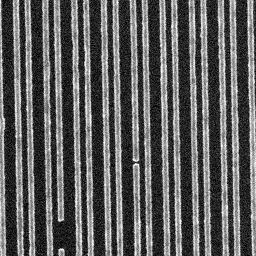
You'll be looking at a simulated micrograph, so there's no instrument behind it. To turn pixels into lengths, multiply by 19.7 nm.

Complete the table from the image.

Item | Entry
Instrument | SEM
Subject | parallel lines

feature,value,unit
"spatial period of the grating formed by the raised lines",287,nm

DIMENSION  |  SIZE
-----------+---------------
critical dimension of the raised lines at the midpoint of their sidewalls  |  101 nanometers